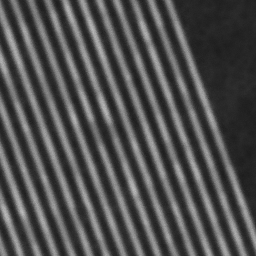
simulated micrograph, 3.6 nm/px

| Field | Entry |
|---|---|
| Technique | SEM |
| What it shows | parallel lines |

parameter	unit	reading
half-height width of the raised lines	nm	19.8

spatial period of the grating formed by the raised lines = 57.9 nanometres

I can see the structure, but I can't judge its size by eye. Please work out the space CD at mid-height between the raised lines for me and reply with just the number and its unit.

40.2 nanometres